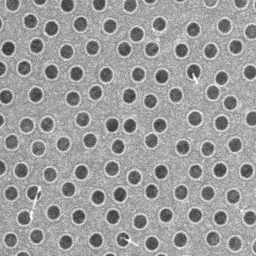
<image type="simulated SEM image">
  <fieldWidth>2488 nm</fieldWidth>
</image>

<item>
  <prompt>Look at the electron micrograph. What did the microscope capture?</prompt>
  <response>a regular array of holes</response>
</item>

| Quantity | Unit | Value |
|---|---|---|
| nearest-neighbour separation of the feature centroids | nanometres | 228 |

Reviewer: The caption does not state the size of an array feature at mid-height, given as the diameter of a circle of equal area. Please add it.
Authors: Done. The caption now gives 14.6 pixels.